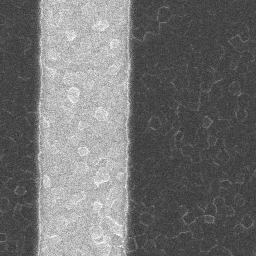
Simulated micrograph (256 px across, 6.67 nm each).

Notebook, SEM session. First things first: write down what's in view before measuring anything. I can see one or a few lines or trenches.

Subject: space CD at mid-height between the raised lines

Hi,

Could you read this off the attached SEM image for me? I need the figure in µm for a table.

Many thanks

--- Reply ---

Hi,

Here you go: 0.576